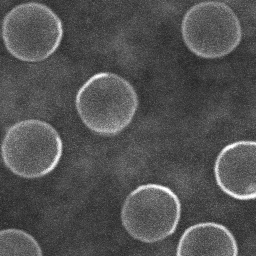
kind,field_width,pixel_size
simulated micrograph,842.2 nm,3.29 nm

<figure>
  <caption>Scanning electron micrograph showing raised bodies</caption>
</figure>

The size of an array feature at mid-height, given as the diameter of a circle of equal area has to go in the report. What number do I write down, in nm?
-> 189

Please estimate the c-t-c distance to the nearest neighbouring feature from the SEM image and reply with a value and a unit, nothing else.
338 nanometres